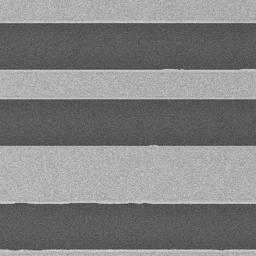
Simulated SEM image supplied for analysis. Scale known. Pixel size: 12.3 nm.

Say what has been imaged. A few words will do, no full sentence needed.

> lines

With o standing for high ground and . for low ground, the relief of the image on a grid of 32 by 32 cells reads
oooooooooooooooooooooooooooooooo
oooooooooooooooooooooooooooooooo
oooooooooooooooooooooooooooooooo
................................
................................
................................
................................
................................
................................
oooooooooooooooooooooooooooooooo
oooooooooooooooooooooooooooooooo
oooooooooooooooooooooooooooooooo
................................
................................
................................
................................
................................
................................
oooooooooooooooooooooooooooooooo
oooooooooooooooooooooooooooooooo
oooooooooooooooooooooooooooooooo
oooooooooooooooooooooooooooooooo
oooooooooooooooooooooooooooooooo
oooooooooooooooooooooooooooooooo
oooooooooooooooooooooooooooooooo
................................
................................
................................
................................
................................
................................
oooooooooooooooooooooooooooooooo